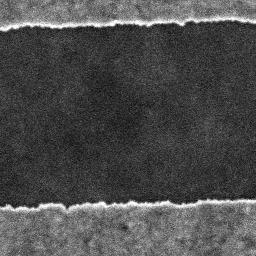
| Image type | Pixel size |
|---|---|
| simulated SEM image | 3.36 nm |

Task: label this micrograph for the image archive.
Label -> one or a few lines or trenches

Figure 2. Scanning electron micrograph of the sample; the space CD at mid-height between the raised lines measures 604 nm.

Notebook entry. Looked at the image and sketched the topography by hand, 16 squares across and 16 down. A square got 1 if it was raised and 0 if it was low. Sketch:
1111111111111111
1111111000000000
0000000000000000
0000000000000000
0000000000000000
0000000000000000
0000000000000000
0000000000000000
0000000000000000
0000000000000000
0000000000000000
0000000000000000
0000000000000000
1111111111111111
1111111111111111
1111111111111111